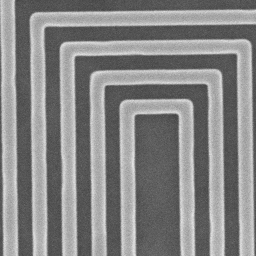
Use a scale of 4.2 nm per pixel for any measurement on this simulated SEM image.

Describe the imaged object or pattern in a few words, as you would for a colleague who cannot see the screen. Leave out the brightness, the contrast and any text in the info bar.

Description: groups of lines, slits or small figures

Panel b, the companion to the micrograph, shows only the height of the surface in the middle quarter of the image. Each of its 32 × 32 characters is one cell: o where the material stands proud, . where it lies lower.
oo..............................
oo..............................
oo.....ooooooooooooooooooooooooo
oo.....ooooooooooooooooooooooooo
oo.....ooooooooooooooooooooooooo
oo.....ooo......................
oo.....ooo......................
ooo....ooo......................
ooo....ooo......................
oo.....ooo.....ooooooooooooooooo
ooo....ooo....oooooooooooooooooo
ooo....ooo....oooooooooooooooooo
ooo....ooo....oooo...........ooo
ooo....ooo....ooo............ooo
ooo....ooo....ooo............ooo
ooo....ooo....ooo............ooo
ooo....ooo....ooo............ooo
ooo....ooo....ooo............ooo
ooo....ooo....ooo............ooo
ooo....ooo....oooo...........ooo
ooo....ooo....oooo...........ooo
ooo....ooo....oooo...........ooo
ooo....ooo....ooo............ooo
ooo....ooo....ooo............ooo
ooo....ooo....ooo............ooo
ooo....ooo....ooo............ooo
ooo....ooo....ooo............ooo
ooo....ooo....oooo...........ooo
ooo....ooo....oooo...........ooo
ooo....ooo....oooo...........ooo
ooo....ooo....oooo...........ooo
ooo....ooo....oooo...........ooo